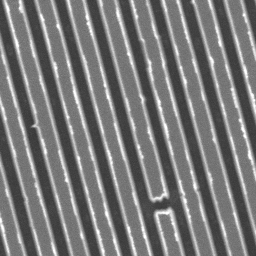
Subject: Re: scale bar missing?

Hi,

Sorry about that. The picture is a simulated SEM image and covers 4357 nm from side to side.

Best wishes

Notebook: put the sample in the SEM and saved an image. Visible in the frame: parallel lines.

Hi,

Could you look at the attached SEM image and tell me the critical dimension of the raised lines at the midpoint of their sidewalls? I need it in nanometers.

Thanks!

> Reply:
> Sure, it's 290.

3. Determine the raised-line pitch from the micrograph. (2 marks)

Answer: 520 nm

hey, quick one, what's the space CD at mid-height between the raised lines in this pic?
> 228 nanometres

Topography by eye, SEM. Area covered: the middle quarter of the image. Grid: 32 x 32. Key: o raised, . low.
oo...oooo....oooo....oooo....ooo
oo...ooooo...ooooo...ooooo...ooo
oo....oooo...ooooo...ooooo...ooo
oo....oooo....oooo....oooo...ooo
ooo...oooo....ooooo...oooo....oo
ooo...ooooo...ooooo...ooooo...oo
ooo....oooo....oooo...ooooo...oo
ooo....oooo....oooo....oooo....o
oooo...ooooo...ooooo...oooo....o
oooo...ooooo...ooooo...ooooo...o
oooo....oooo....oooo...ooooo...o
oooo....oooo....oooo....oooo....
ooooo...ooooo...ooooo...ooooo...
.oooo...ooooo...ooooo...ooooo...
.oooo....oooo....oooo...ooooo...
.oooo....oooo....oooo....oooo...
.ooooo...ooooo...ooooo...ooooo..
..oooo....oooo...ooooo...ooooo..
..oooo....oooo....oooo....oooo..
..ooooo...oooo....oooo....oooo..
..ooooo...ooooo...ooooo...ooooo.
...oooo....oooo...ooooo...ooooo.
...oooo....oooo....oooo....oooo.
...ooooo...oooo....ooooo...oooo.
....oooo...ooooo...ooooo...ooooo
....oooo....oooo....oooo...ooooo
o...oooo....oooo....oooo....oooo
o...ooooo...ooooo...ooooo...oooo
o....oooo...ooooo...ooooo...oooo
o....oooo....oooo....oooo....ooo
oo...oooo....oooo....oooo....ooo
oo...ooooo...ooooo...ooooo...ooo